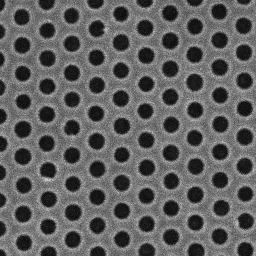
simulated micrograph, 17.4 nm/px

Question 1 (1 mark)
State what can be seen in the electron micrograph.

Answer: a regular array of holes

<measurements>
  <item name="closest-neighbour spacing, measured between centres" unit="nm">481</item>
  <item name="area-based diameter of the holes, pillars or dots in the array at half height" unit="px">17.2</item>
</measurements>